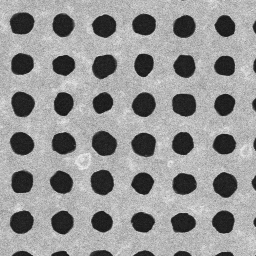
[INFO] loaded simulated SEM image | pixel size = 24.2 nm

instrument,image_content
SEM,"a regular array of holes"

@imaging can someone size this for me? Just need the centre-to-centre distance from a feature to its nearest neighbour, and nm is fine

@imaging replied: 943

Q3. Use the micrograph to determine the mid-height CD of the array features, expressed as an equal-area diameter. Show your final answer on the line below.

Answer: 0.541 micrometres